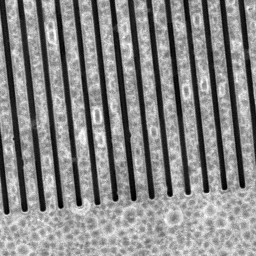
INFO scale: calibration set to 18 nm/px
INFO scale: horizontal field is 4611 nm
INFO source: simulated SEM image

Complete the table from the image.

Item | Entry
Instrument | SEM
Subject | parallel lines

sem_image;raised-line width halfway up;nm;217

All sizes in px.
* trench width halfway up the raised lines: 6.46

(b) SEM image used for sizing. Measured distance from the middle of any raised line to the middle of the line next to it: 329 nm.